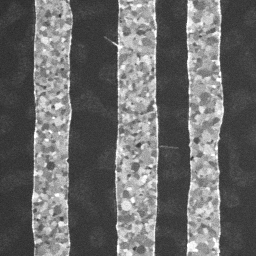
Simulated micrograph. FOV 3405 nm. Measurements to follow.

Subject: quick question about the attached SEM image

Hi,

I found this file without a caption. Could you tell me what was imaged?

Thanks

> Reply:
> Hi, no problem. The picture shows one or a few lines or trenches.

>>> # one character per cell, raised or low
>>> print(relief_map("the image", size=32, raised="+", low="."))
....+++++......++++.....+++.....
....+++++......++++.....++++....
.....++++......++++.....++++....
....+++++......+++++...+++++....
....+++++......++++....++++.....
....+++++......++++....++++.....
....+++++......++++.....+++.....
....+++++......++++....++++.....
....+++++......++++....+++++....
....+++++......++++.....++++....
....+++++......++++.....++++....
....+++++......++++.....++++....
....+++++......++++.....++++....
.....++++......+++++....++++....
.....++++......+++++....++++....
.....++++......+++++....++++....
....+++++......+++++....+++.....
....+++++......+++++....+++.....
....++++.......+++++....+++.....
....++++.......+++++....+++.....
....++++.......+++++....+++.....
....++++.......+++++....+++..+..
....+++++......+++++....+++.....
....+++++......+++++....+++.....
....++++.......+++++....+++.....
....++++......++++++...++++..+..
....++++.......+++++...++++.....
....++++.......++++.....+++.....
....++++.......++++.....++++....
....+++++......++++....++++.....
....+++++......++++.....+++.....
....+++++......++++....++++.....